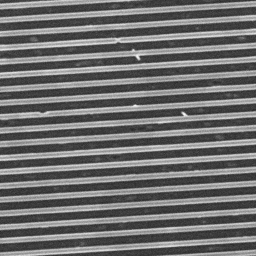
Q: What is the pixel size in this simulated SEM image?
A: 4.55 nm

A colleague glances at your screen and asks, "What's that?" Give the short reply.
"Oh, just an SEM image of parallel lines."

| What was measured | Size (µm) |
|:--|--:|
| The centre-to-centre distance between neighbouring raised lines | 0.0627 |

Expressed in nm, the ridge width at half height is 23.3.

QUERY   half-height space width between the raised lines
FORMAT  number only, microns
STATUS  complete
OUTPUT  0.0392